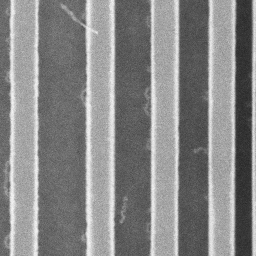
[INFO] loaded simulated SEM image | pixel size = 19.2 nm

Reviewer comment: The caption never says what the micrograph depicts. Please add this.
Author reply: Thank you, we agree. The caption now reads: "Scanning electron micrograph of lines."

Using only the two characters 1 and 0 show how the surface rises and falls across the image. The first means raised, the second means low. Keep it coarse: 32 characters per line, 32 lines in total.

01111000000111000001110000111000
01111000000111000001110000111000
01111000000111000001110000111000
01111000000111000001110000111000
01111000000111000001110000111000
01111000000111000001110000111000
01111000000111000001110000111000
01111000000111000001110000111000
01111000000111000001110000111000
01111000000111000001110000111000
01111000000111000001110000111000
01111000000111000001110000111000
01111000000111000001110000111000
01111000000111000001110000111000
01111000000111000001110000111000
01111000000111000001110000111000
01111000000111000001110000111000
01111000000111000001110000111000
01111000000111000001110000111000
01111000000111000001110000111000
01111000000111000001110000111000
01111000000111000001110000111000
01111000000111000001110000111000
01111000000111000001110000111000
01111000000111000001110000111000
01111000000111000001110000111000
01111000000111000001110000111000
01111000000111000001110000111000
01111000000111000001110000111000
01111000000111000001110000111000
01111000000111000001110000111000
01111000000111000001110000111000